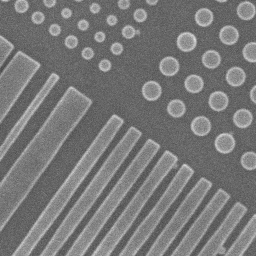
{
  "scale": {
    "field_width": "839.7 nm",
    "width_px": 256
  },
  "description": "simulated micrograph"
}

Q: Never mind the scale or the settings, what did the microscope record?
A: groups of lines, slits or small figures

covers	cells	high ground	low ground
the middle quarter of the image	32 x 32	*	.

.........***............****....
..........*.............****....
.........................**.....
...............................*
..............................**
....................****......**
.**.................****.......*
****................****........
******..............***.........
*******....................**...
******....................****..
******....................****..
*****.....................****..
****........**..................
****.......****.................
***.......****..................
**........***...**..............
*........****...***.............
........****...****.............
........****..****...*..........
.......****..****...****........
......****..****...****.........
.....****...****...****..**.....
....*****..****...****..****....
....****..*****..****...****....
...****...****..****...****...*.
..****...****...****..****...***
..****..****...****...****..****
.****...****..****...****...****
****...****..****...****...****.
****..****...****...***...****..
***..*****..****...****...***...